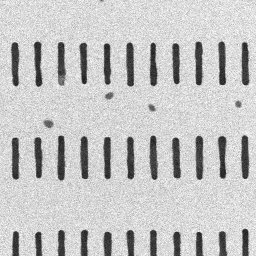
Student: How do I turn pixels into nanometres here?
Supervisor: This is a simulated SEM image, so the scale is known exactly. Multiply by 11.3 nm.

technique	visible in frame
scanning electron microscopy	a regular array of holes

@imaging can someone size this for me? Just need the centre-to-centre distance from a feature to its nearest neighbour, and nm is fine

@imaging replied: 258